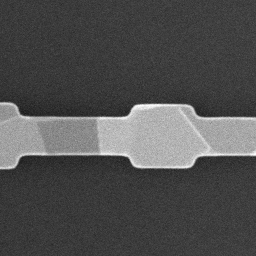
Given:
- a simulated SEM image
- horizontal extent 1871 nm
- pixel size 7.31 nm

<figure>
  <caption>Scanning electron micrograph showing wiring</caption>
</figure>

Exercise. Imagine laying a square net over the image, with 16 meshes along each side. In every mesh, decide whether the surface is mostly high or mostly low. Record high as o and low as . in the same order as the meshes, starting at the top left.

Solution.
................
................
................
................
................
................
o...............
oooooooooooooooo
oooooooooooooooo
oooooooooooooooo
o...............
................
................
................
................
................